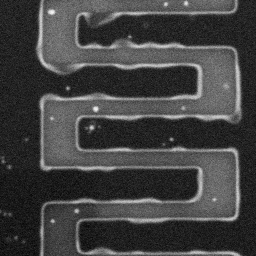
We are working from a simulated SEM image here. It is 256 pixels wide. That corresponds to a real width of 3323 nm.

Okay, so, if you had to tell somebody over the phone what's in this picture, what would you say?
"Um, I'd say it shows groups of lines, slits or small figures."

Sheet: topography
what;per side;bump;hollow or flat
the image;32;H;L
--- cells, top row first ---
HHHHHLLLLLLLLLLLLLLLLLLLLLLLLHHH
HHHHHLLLLLLLLLLLLLLLLLLLLLLLLHHH
HHHHHLLLLLHHHHHHHHHHHHHHHHHHHHHH
HHHHHLLLLLHHHHHHHHHHHHHHHHHHHHHH
HHHHHLLLLLHHHHHHHHHHHHHHHHHHHHHH
HHHHHLLLLLHHHHHHHHHHHHHHHHHHHHHH
HHHHHLLLLLLLLLLLLLLLLLLLLLLLLHHH
HHHHHLLLLLLLLLLLLLLLLLLLLLLLLHHH
HHHHHHHLLHHHHHHHHHHHHHHHHLLLLLHH
HHHHHHHHHHHHHHHHHHHHHHHHHLLLLLHH
HHHHHHHHHHHHHHHHHHHHHHHHHLLLLLHH
HHHHHHHHHHHHHHHHHHHHHHHHHLLLLLHH
HHHHHHLLLLLLLLLLLLLLLLLLLLLLLLHH
HHHHHLLLLLLLLLLLLLLLLLLLLLLLLLHH
HHHHHLLLLLHHLLLLLHHHHLHHHLLLLHHH
HHHHHLLLLLHHHHHHHHHHHHHHHHHHHHHH
HHHHHLLLLLHHHHHHHHHHHHHHHHHHHHHH
HHHHHLLLLLHHHHHHHHHHHHHHHHHHHHHH
HHHHHLLLLLHHHHHHHHHHHHHHHHHHHHHH
HHHHHLLLLLLLLLLLLLLLLLLLLLLLLHHH
HHHHHLLLLLLLLLLLLLLLLLLLLLLLLLHH
HHHHHHHHHHHHHHHHHHHHHHHHHLLLLLHH
HHHHHHHHHHHHHHHHHHHHHHHHHLLLLLHH
HHHHHHHHHHHHHHHHHHHHHHHHHLLLLLHH
HHHHHHHHHHHHHHHHHHHHHHHHHLLLLLHH
HHHHHHLLLLLLLLLLLLLLLLLLLLLLLLHH
HHHHHLLLLLLLLLLLLLLLLLLLLLLLLHHH
HHHHHLLLLLHHHHHHHLLLHHHHHHHHHHHH
HHHHHLLLLLHHHHHHHHHHHHHHHHHHHHHH
HHHHHLLLLLHHHHHHHHHHHHHHHHHHHHHH
HHHHHLLLLLHHHHHHHHHHHHHHHHHHHHHH
HHHHHLLLLLHHLLHHHHHHHHHHHHHHHHHH